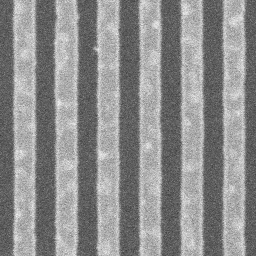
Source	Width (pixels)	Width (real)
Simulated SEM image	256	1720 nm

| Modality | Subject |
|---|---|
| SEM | parallel lines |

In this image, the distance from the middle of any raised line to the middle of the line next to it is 41.8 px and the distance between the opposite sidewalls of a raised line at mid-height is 131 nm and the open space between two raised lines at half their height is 148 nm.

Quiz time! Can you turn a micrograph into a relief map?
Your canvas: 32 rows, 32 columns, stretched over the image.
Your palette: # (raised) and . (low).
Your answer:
..##...##...###...##...##...##..
..##...###..###...##...##...##..
..##...###..###...##...##...##..
..##...###..###...##...##...##..
..##...###..###...##...##...##..
..##...###..###...##...##...##..
..##...###..###...##...##...##..
..##...###..###...##...##...##..
..##...###..###...##...##...##..
..##...###..###...##...##...##..
..##...##...###...##...##...##..
..##...###..###...##...##...##..
..##...##...###...##...##...##..
..##...##...###...##...##...##..
..##...###..###...##...##...##..
..##...##...###...##...##...##..
..##...##...###...##...##...##..
..##...##...###...##...##...##..
..##...##...###...##...##...##..
..##...###..###...##...##...##..
..##...###..###...##...##...##..
..##...##...###...##...##...##..
..##...###..###...##...##...##..
..##...###..###...##...##...##..
..##...###..###...##...##...##..
..##...###..###...##...##...##..
..##...##...###...##...##...##..
..##...##...###...##...##...##..
..##...##...###...##...##...##..
..##...###..###...##...##...##..
..##...###..###...##...##...###.
..##...##...###...##...##...###.